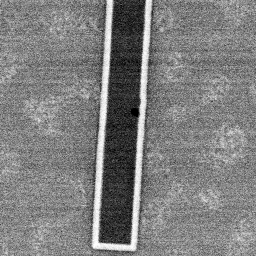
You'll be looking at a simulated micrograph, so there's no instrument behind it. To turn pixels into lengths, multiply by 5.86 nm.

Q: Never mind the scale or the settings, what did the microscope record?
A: one or a few lines or trenches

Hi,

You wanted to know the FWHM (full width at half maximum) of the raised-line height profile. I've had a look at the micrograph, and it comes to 229 nanometers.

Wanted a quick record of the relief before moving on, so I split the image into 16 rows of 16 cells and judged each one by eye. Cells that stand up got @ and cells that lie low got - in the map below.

-------@@-------
-------@@-------
-------@@-------
-------@@-------
-------@@-------
-------@@-------
-------@@-------
------@@@-------
------@@@-------
------@@@-------
------@@@-------
------@@@-------
------@@@-------
------@@--------
------@@--------
----------------